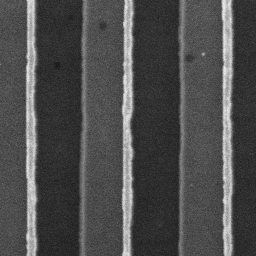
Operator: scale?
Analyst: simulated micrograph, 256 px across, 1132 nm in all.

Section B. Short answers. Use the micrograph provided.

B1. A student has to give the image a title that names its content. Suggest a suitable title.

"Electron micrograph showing lines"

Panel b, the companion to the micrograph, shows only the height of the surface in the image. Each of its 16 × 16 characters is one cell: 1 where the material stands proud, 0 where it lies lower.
1100011100011100
1100011100011100
1100011100011100
1100011100011100
1100011100011100
1100011100011100
1100011100011100
1100011100011100
1100011100011100
1100011100011100
1100011100011100
1100011100011100
1100011100011100
1100011100011100
1100011100011100
1100011100011100